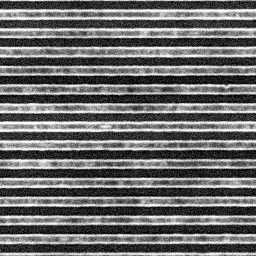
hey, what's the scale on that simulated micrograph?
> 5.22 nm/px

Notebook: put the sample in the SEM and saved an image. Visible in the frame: parallel lines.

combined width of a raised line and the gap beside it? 97.5 nanometers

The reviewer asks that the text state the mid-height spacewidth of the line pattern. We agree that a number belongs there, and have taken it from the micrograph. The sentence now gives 0.0522 microns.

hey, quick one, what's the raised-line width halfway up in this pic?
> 41.7 nanometres